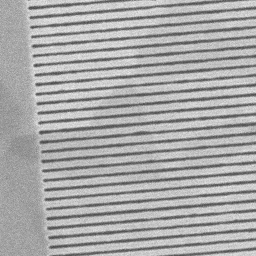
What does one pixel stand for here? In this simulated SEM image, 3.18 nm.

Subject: parallel lines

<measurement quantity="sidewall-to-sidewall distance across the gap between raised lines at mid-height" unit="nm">11.1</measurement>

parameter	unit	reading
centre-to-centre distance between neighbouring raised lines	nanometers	30.5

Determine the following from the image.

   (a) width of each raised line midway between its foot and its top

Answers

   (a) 0.0194 µm